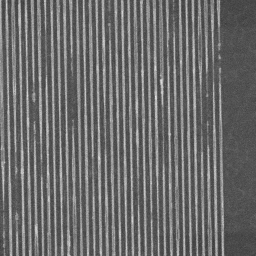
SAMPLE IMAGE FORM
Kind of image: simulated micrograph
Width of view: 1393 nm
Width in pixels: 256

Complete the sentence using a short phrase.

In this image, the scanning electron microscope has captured parallel lines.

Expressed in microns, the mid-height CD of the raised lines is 0.0109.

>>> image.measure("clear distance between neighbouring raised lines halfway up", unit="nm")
25.2